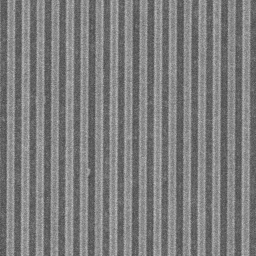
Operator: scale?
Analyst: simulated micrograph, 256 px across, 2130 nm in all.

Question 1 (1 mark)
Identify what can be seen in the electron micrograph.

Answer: parallel lines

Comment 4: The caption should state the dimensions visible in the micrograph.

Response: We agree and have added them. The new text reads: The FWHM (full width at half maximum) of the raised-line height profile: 56.2 nanometres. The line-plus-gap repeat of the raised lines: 0.122 micrometres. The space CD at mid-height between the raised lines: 71.8 nanometres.